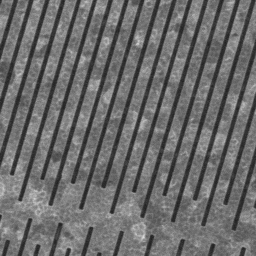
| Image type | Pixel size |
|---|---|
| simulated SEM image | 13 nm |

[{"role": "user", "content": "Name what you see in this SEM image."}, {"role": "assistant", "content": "parallel lines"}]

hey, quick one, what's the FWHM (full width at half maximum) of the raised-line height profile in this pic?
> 131 nm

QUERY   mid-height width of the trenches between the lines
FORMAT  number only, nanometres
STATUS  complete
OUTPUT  68.5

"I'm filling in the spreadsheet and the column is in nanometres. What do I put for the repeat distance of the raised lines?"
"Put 197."